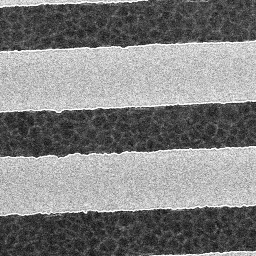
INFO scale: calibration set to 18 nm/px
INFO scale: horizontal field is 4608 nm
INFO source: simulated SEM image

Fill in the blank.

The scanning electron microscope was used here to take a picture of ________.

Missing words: one or a few lines or trenches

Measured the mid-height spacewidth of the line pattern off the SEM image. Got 0.83 µm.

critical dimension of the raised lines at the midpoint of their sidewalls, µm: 1.06